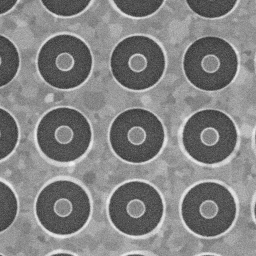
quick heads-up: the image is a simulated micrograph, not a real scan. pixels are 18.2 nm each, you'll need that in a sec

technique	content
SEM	an array of small figures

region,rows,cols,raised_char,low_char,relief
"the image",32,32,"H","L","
LLHHHLLLLLLHHHLLLLLLHHHLLLLLLLHH
LHHHHHLLLLHHHHHLLLLHHHHHLLLLLHHH
HHHHHHHHHHHHHHHHHHHHHHHHHHHHHHHH
HHHHHHHHHHHHHHHHHHHHHHHHHHHHHHHH
HHHHHHHLLLHHHHHHLLLHHHHHHHHHHHHH
LLHHHLLLLLLHHHHLLLLLHHHHLLLLLHHH
LLHHHLLLLLLHHHLLLLLLLHHLLLLLLLHH
LLHHHLLHHLLLHHLLHHLLLHHLLHHLLLHH
LLHHHLLHHLLLHHLLHHLLLHHLLLHLLLHH
LLHHHLLLLLLHHHLLLLLLHHHLLLLLLHHH
LHHHHHLLLLHHHHHLLLLHHHHHLLLLLHHH
HHHHHHHHHHHHHHHHHHHHHHHHHHHHHHHH
HHHHHHHHHHHHHHHHHHHHHHHHHHHHHHHH
HHHHHHHLLHHHHHHHHHHHHHHHHHHHHHHH
LLHHHLLLLLLHHHHLLLLLHHHHLLLLLHHH
LLHHHLLLLLLHHHLLLLLLHHHLLLLLLHHH
LLHHLLLHHLLHHHLLHHLLLHHLLHHLLLHH
LLHHLLLHHLLHHHLLHHLLLHLLLHHLLLHH
LLHHHLLLLLLHHHLLLLLLHHHLLLLLLLHH
LHHHHLLLLLHHHHHLLLLLHHHHLLLLLHHH
HHHHHHHLLHHHHHHHHHHHHHHHHLLLHHHH
HHHHHHHHHHHHHHHHHHHHHHHHHHHHHHHH
HHHHHHHLLHHHHHHHHLHHHHHHHHHHHHHH
LHHHHLLLLLLHHHLLLLLHHHHHLLLLLHHH
LLHHHLLLLLLHHHLLLLLLHHHLLLLLLHHH
LLHHLLLHHLLHHLLLHHLLLHHLLHHLLLHH
LLHHLLLHHLLHHLLLHHLLLHHLLHHLLLHH
LLHHHLLLLLLHHHLLLLLLHHHLLLLLLHHH
LHHHHLLLLLHHHHLLLLLLHHHLLLLLLHHH
HHHHHHHLHHHHHHHHLLHHHHHHHLLHHHHH
HHHHHHHHHHHHHHHHHHHHHHHHHHHHHHHH
HHHHHHHLLHHHHHHHHHHHHHHHHHHHHHHH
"